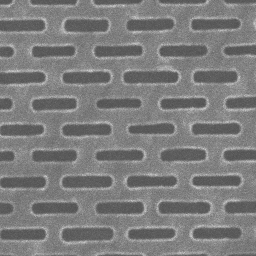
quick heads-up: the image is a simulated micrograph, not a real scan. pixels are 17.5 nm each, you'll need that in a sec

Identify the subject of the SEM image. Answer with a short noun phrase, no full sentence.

a regular array of holes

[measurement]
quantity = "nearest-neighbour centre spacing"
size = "722 nm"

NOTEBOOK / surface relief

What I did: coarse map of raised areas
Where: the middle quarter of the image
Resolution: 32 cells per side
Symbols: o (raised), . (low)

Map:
oooooooooooooooooooooooooooooooo
oooooooooooooooooooooooooooooooo
............ooo..............ooo
............ooo..............ooo
...........oooo.............oooo
oooooooooooooooooooooooooooooooo
oooooooooooooooooooooooooooooooo
oooooooooooooooooooooooooooooooo
..oooooooo........ooooooo.......
...ooooo...........ooooo........
...ooooo...........ooooo........
ooooooooooooooooooooooooo.oooooo
oooooooooooooooooooooooooooooooo
oooooooooooooooooooooooooooooooo
oooooooooooooooooooooooo..oooooo
............oooo............oooo
............oooo............oooo
............ooooo..........ooooo
oooooooooooooooooooooooooooooooo
oooooooooooooooooooooooooooooooo
oooooooooooooooooooooooooooooooo
...ooooooo.........oooooo.......
...ooooo............oooo........
...ooooo............oooo........
..oooooooooooooooooooooooooooooo
oooooooooooooooooooooooooooooooo
oooooooooooooooooooooooooooooooo
oooooooooooooooooooooooooooooooo
............oooo............oooo
............oooo............oooo
............oooo............oooo
oooooooooooooooooooooooooooooooo